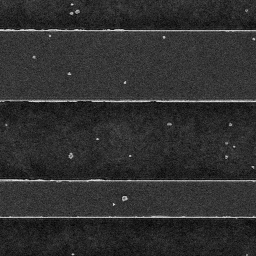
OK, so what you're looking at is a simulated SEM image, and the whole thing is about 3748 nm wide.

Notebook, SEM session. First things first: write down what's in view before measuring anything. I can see lines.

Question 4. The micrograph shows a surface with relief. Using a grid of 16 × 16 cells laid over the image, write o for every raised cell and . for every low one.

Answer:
................
................
oooooooooooooooo
oooooooooooooooo
oooooooooooooooo
oooooooooooooooo
................
................
................
................
................
oooooooooooooooo
oooooooooooooooo
oooooooooooooooo
................
................